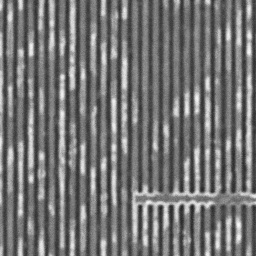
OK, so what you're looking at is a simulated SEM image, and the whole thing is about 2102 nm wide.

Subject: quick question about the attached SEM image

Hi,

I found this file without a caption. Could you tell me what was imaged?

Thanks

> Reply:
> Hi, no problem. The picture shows parallel lines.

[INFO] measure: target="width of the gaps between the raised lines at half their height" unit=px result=6.25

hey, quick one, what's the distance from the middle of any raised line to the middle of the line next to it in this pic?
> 85.2 nanometres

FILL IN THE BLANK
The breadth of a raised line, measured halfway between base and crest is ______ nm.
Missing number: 37